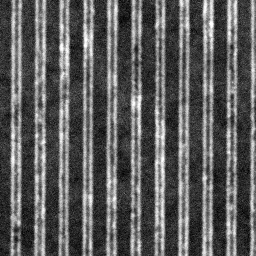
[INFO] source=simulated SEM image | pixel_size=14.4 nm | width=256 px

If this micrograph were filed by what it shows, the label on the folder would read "parallel lines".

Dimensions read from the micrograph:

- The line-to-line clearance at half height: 16.7 pixels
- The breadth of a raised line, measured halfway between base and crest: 106 nanometers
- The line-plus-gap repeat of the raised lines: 345 nm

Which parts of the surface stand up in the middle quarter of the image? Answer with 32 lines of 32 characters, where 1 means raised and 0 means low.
10000110000110000110000110000110
10000110000110000110000110000110
10000110000110000110000110000110
10000110000110000110000110000110
10000110000110000110000110000110
10000110000110000110000110000110
10000110000110000110000110000110
10000110000110000110000110000110
10000110000110000110000110000110
10000110000110000110000110000110
10000110000110000110000110000110
10000110000110000110000110000110
10000110000110000110000110000110
10000110000110000110000110000110
10000110000110000110000110000110
10000110000110000110000110000110
10000110000110000110000110000110
10000110000110000110000110000110
10000110000110000110000110000110
10000110000110000110000110000110
10000110000110000110000110000110
10000110000110000110000110000110
10000110000110000110000110000110
10000110000110000110000110000110
10000110000110000110000110000110
10000110000110000110000110000110
10000110000110000110000110000110
10000110000110000110000110000110
10000100000110000110000110000110
10000110000110000110000110000110
10000110000110000110000110000110
10000110000110000110000110000110